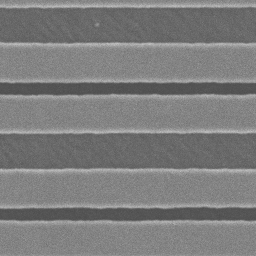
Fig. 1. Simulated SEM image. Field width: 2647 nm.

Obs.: lines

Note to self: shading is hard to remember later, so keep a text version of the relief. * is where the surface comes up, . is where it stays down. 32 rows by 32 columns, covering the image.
********************************
................................
................................
................................
................................
*****.*..*************.**.***..*
********************************
********************************
********************************
********************************
................................
................................
********************************
********************************
********************************
********************************
********************************
................................
................................
................................
................................
********************************
********************************
********************************
********************************
********************************
................................
................................
********************************
********************************
********************************
********************************